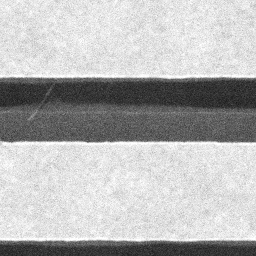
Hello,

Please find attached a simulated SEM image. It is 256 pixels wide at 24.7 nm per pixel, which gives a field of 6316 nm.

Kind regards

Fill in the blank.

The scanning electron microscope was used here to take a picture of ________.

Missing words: lines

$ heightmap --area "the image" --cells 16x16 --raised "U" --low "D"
UUUUUUUUUUUUUUUU
UUUUUUUUUUUUUUUU
UUUUUUUUUUUUUUUU
UUUUUUUUUUUUUUUU
UUUUUUUUUUUUUUUU
DDDDDDDDDDDDDDDD
DDDDDDDDDDDDDDDD
UUUUUUUUUUUUUUUU
UUUUUUUUUUUUUUUU
UUUUUUUUUUUUUUUU
UUUUUUUUUUUUUUUU
UUUUUUUUUUUUUUUU
UUUUUUUUUUUUUUUU
UUUUUUUUUUUUUUUU
UUUUUUUUUUUUUUUU
DDDDDDDDDDDDDDDD